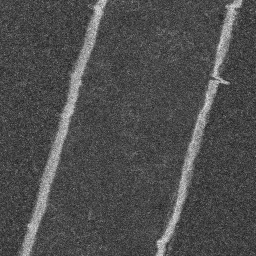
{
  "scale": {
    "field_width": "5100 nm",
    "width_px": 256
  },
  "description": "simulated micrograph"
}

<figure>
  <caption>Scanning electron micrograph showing one or a few lines or trenches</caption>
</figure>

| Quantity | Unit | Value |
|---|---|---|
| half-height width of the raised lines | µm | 2.6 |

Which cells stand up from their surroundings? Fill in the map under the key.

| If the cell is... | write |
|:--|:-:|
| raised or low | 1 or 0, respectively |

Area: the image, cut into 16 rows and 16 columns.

0000001111111110
0000001111111100
0000001111111100
0000011111111100
0000011111111100
0000011111111000
0000111111111000
0000111111111000
0000111111110000
0000111111110000
0001111111110000
0001111111100000
0001111111100000
0011111111100000
0011111111100000
0011111111000000